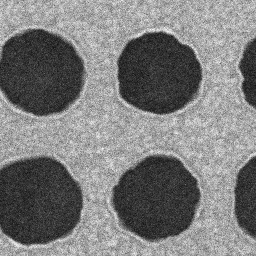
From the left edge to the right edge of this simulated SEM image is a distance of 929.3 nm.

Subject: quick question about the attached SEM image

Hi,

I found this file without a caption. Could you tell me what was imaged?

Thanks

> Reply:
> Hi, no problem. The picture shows holes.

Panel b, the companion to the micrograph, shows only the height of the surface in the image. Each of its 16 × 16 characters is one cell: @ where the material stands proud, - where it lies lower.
@@@@@@@@@@@@@@@@
@@@@@@@@@@@@@@@@
----@@@@---@@@@@
-----@@@----@@@-
-----@@------@@-
-----@@-----@@@-
@----@@@----@@@@
@@@@@@@@@@@@@@@@
@@@@@@@@@@@@@@@@
@@@@@@@@@@@@@@@@
----@@@@----@@@-
-----@@-----@@@-
-----@@------@@-
-----@@-----@@@-
----@@@@---@@@@-
@@@@@@@@@@@@@@@@